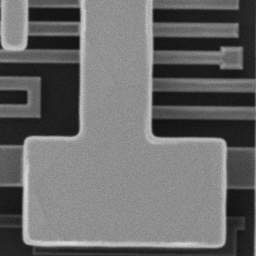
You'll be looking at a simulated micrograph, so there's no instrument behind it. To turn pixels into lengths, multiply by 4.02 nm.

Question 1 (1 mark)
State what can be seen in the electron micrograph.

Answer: wiring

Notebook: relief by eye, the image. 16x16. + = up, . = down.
++...++++.......
++...++++.......
++...+++++......
.....+++++......
.....++++.......
.....++++.......
.....++++.......
.....++++.......
.....+++++......
..++++++++++++..
..++++++++++++..
..++++++++++++..
.+++++++++++++..
.+++++++++++++..
.+++++++++++++..
................